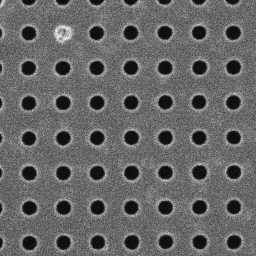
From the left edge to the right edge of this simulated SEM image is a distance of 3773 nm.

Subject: a regular array of holes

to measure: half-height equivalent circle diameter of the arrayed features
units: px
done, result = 14.9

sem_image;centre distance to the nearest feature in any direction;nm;501